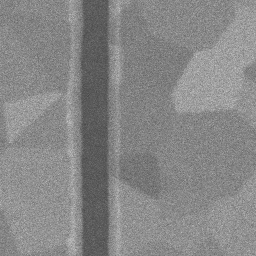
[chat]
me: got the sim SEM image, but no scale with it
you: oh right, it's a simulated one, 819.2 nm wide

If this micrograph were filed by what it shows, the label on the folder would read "one or a few lines or trenches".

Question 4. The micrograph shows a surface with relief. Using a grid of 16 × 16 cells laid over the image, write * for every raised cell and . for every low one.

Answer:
*****..*********
*****..*********
*****..*********
*****..*********
*****..*********
*****..*********
*****..*********
*****..*********
*****..*********
*****..*********
*****..*********
*****..*********
*****..*********
*****..*********
*****..*********
*****..*********